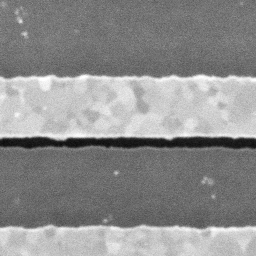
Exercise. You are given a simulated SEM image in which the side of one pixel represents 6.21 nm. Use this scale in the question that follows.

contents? lines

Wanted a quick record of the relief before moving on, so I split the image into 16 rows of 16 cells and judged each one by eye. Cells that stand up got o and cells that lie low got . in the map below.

................
................
................
................
................
oooooooooooooooo
oooooooooooooooo
oooooooooooooooo
oooooooooooooooo
................
................
................
................
................
oooooooooooooooo
oooooooooooooooo